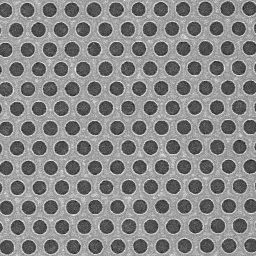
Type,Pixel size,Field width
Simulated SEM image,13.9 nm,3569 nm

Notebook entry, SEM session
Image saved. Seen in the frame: a regular array of holes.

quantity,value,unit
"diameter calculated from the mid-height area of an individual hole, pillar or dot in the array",207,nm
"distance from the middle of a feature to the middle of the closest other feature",308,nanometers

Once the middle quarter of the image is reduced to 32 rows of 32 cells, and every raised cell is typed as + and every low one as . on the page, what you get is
.++....++...++....++...++....++.
.++....+....++....++...++....++.
.++...+++...+++..+++...+++..++++
++++++++++++++++++++++++++++++++
+..++++.+++++.++++.++++...+++..+
....++...++....++....+....++....
....++...++....++...+++...++....
+...++...+++..++++..+++...+++..+
++++++++++++++++++++++++++++++++
++++..+++...+++..+++...+++..++++
.++....++...++....++...++....++.
.++....++...++....++...++....++.
.+++..+++...+++..+++...+++..++++
++++++++++++++++++++++++++++++++
+..++++..+++..++++..+++...+++..+
....++...++....++....+....++....
....++...++....++....++...++....
+..++++..+++..++++..+++..++++..+
++++++++++++++++++++++++++++++++
.+++..+++...+++..++++..+++..+++.
.++....++...++....++...++....++.
.++....++...++....++...+++...++.
.+++..+++...+++..++++..++++.++++
++++++++++++++++++++++++++++++++
+..++++..+++...+++..+++...+++..+
....++...+++...++....++...++....
....++...+++...++....++...++....
+..++++..++++.++++..++++.++++..+
++++++++++++++++++++++++++++++++
.+++..+++...+++..+++...+++...++.
.++....++...++....++....+....++.
.++....++...+++...++...+++...++.